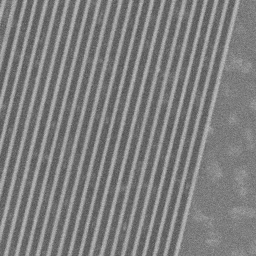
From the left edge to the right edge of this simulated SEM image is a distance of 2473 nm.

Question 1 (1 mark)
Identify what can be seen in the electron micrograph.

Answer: parallel lines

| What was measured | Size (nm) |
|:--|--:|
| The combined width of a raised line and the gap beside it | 99.7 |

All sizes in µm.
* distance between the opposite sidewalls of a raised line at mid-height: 0.0329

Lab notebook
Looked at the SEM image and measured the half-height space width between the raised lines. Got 68.1 nanometers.